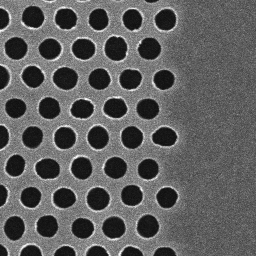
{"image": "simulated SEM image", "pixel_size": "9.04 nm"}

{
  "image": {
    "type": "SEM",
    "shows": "a regular array of holes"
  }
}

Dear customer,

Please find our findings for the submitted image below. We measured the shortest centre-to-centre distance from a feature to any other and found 295 nanometres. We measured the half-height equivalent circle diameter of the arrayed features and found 0.2 micrometres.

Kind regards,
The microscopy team